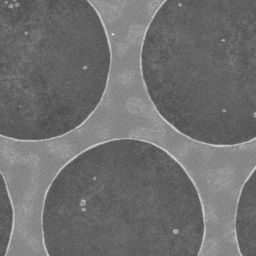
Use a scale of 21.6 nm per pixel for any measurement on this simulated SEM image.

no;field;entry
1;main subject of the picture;holes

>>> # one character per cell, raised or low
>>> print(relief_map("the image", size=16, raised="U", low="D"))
DDDDDDUUUUDDDDDD
DDDDDDUUUDDDDDDD
DDDDDDDUUDDDDDDD
DDDDDDDUUDDDDDDD
DDDDDDDUUDDDDDDD
DDDDDDDUUDDDDDDD
DDDDDDUUUUDDDDDD
DDDDDUUUUUDDDDDD
DDDDUUUUUUUUDDDD
UUUUUDDDDDUUUUUU
UUUUDDDDDDDUUUUU
UUUDDDDDDDDDUUUD
DUUDDDDDDDDDDUUD
DUUDDDDDDDDDDUUD
DUUDDDDDDDDDDUUD
UUUDDDDDDDDDDUUD